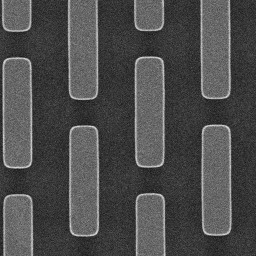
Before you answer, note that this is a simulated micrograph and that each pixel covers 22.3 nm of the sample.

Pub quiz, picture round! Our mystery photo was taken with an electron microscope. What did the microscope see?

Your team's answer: groups of lines, slits or small figures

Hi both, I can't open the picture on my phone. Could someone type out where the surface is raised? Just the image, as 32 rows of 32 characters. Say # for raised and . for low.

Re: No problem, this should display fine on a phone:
####.....###.....###.....####...
####.....###.....###.....####...
####.....###.....###.....####...
.###.....###.....###.....####...
.........###.............####...
.........###.............####...
.........###.............####...
.##......###.....###.....####...
####.....###.....###.....####...
####.....###.....###.....####...
####.....###.....####....####...
####.....###.....####....####...
####.............####...........
####.............####...........
####.............####...........
####.............####...........
####.....###.....####....####...
####.....###.....####....####...
####.....###.....####....####...
####.....###.....####....####...
.###.....###.....###.....####...
.........###.............####...
.........###.............####...
.........###.............####...
.###.....###.....###.....####...
.###.....###.....####....####...
.###.....###.....####....####...
.###.....###.....####....####...
.###.....###.....####....####...
.###.............####...........
.###.............####...........
.###.............####...........